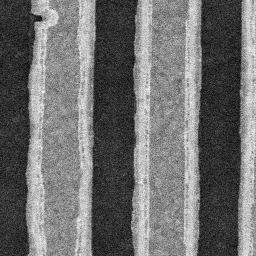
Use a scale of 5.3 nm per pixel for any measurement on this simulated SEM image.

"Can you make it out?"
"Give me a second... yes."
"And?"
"one or a few lines or trenches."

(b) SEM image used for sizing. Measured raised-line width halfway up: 48.5 pixels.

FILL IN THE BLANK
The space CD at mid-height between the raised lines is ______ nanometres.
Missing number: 300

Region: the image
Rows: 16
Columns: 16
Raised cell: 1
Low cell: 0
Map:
0001100001110000
0001100001110000
0011100001110000
0011100001110000
0011100001110000
0011100001110000
0011100001110000
0011100001110000
0011100001110000
0011100001110000
0011100001110000
0011100001110001
0011100001110001
0011100001110001
0011100001110001
0011100001110001